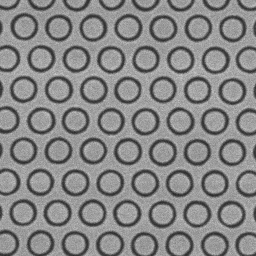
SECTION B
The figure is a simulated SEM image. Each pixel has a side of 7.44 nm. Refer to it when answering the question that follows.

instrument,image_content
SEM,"a regular array of ring-shaped grooves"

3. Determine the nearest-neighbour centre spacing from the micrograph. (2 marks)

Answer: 258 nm